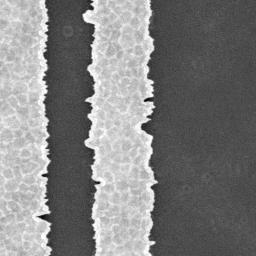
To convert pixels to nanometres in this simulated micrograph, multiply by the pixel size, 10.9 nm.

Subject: one or a few lines or trenches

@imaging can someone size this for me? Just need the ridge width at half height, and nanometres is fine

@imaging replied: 604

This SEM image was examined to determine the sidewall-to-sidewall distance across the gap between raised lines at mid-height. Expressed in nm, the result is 532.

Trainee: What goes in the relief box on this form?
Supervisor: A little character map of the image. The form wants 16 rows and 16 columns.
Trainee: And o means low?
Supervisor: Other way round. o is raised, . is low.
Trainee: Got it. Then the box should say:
ooo...ooo.......
ooo...ooo.......
ooo...ooo.......
ooo...ooo.......
ooo...ooo.......
ooo...ooo.......
ooo...ooo.......
ooo...ooo.......
ooo...ooo.......
ooo...ooo.......
ooo...ooo.......
ooo...oooo......
ooo...oooo......
ooo...ooo.......
ooo...ooo.......
ooo...ooo.......